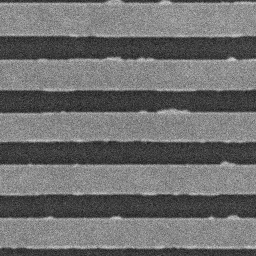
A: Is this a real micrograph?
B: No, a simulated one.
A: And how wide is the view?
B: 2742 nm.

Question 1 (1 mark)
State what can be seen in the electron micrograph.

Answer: lines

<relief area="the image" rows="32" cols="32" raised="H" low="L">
HHHHHHHHHHHHHHHHHHHHHHHHHHHHHHHH
HHHHHHHHHHHHHHHHHHHHHHHHHHHHHHHH
HHHHHHHHHHHHHHHHHHHHHHHHHHHHHHHH
HHHHHHHHHHHHHHHHHHHHHHHHHHHHHHHH
LLLLLLLLHHHLHHHHHHHHHHHHHHHHHHLL
LLLLLLLLLLLLLLLLLLLLLLLLLLLLLLLL
LLLLLLLLLLLLLLLLLLLLLLLLLLLLLLLL
LLLLHHLLHHHHHHHLHLLLLLLLLLLLHHLH
HHHHHHHHHHHHHHHHHHHHHHHHHHHHHHHH
HHHHHHHHHHHHHHHHHHHHHHHHHHHHHHHH
HHHHHHHHHHHHHHHHHHHHHHHHHHHHHHHH
LLLLLLLLLLLLLLLLLLLLLLLLLLLLLLLL
LLLLLLLLLLLLLLLLLLLLLLLLLLLLLLLL
LLLLLLLLLLLLLLLLLLLLLLLLLLLLLLLL
HHHHHHHHHHHHHHHHHHHHHHHHHHHHHHHH
HHHHHHHHHHHHHHHHHHHHHHHHHHHHHHHH
HHHHHHHHHHHHHHHHHHHHHHHHHHHHHHHH
HHHHHHHHHHHHHHHHHHHHHHHHHHHHHHHH
LLLLLLLLLLLLLLLLLLLLLLLLLLLLLLLL
LLLLLLLLLLLLLLLLLLLLLLLLLLLLLLLL
LLLLLLLLLLLLLLLLLLLLLLLLLLLLLLLL
HHHHHHHHHHHHHHHHHHHHHHHHHHHHHHHH
HHHHHHHHHHHHHHHHHHHHHHHHHHHHHHHH
HHHHHHHHHHHHHHHHHHHHHHHHHHHHHHHH
LLLLLLLLLLLLLLLLLLLLLLLLLLLLLLLL
LLLLLLLLLLLLLLLLLLLLLLLLLLLLLLLL
LLLLLLLLLLLLLLLLLLLLLLLLLLLLLLLL
HHHHHHHHHHHHHHHHHHHHHHHHHHHHHHHH
HHHHHHHHHHHHHHHHHHHHHHHHHHHHHHHH
HHHHHHHHHHHHHHHHHHHHHHHHHHHHHHHH
HHHHHHHHHHHHHHHHHHHHHHHHHHHHHHHH
LLLLLLLLLLLLLLLLLLLLLLLLLLLLLLLL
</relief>